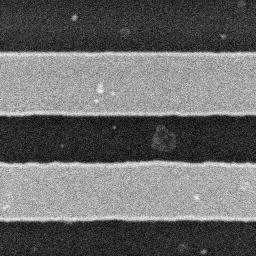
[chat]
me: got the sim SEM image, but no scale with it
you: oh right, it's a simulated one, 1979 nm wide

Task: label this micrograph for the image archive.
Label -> lines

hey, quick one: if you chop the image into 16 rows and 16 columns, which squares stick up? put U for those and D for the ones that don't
DDDDDDDDDDDDDDDD
DDDDDDDDDDDDDDDD
DDDDDDDDDDDDDDDD
UUUUUUUUUUUUUUUU
UUUUUUUUUUUUUUUU
UUUUUUUUUUUUUUUU
UUUUUUUUUUUUUUUU
DDDDDDDDDDDDDDDD
DDDDDDDDDDDDDDDD
DDDDDDDDDDDDDDDD
UUUUUUUUUUUUUUUU
UUUUUUUUUUUUUUUU
UUUUUUUUUUUUUUUU
UUUUUUUUUUUUUUUU
DDDDDDDDDDDDDDDD
DDDDDDDDDDDDDDDD